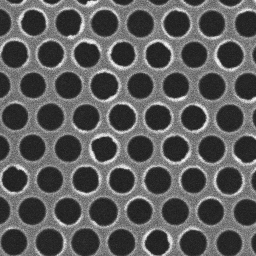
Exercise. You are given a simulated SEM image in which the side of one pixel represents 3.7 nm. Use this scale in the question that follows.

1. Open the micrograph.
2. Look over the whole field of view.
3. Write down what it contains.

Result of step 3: a regular array of holes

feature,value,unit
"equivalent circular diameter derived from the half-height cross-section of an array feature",95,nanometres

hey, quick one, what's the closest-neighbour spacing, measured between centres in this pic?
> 0.132 µm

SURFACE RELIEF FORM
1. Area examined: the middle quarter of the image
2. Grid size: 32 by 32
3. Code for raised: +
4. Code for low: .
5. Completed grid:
++++...+++++++..++++++....+++++.
++++++++++++++++++++++++++++++++
...+++++....++++++..+++++++...++
....+++......++++.....++++....++
....+++......+++......+++......+
....+++.......++......+++......+
....+++......+++......+++......+
....++++.....++++....++++.....++
..++++++...+++++++..+++++++..+++
++++++++++++++++++++++++++++++++
++++...++++++...++++++..++++++++
+++.....++++.....++++.....++++..
++.......+++......+++......+++..
++.......++.......++.......++...
+++......+++......+++......++...
+++.....++++.....++++.....++++..
+++++.+++++++...++++++...+++++++
++++++++++++++++++++++++++++++++
...+++++....+++++....+++++....++
....+++......+++......+++......+
....+++......+++......+++......+
....+++......+++......+++......+
....+++......+++......+++......+
...+++++....+++++....+++++....++
+.++++++++++++++++++++++++++++++
++++++++++++++++++++++++++++++++
+++....++++++...+++++.....+++++.
++......++++.....++++.....++++..
++.......++.......++.......++...
++.......++.......++.......++...
+++.....++++.....+++......++++..
++++....++++....+++++.....+++++.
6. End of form